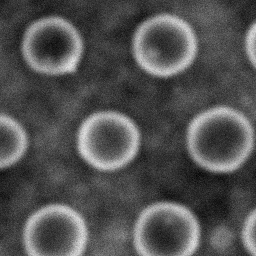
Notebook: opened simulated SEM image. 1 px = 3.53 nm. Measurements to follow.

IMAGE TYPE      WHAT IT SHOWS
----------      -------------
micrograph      raised bodies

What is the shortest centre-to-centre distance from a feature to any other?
387 nanometers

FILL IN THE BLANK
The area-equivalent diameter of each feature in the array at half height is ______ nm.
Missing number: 203